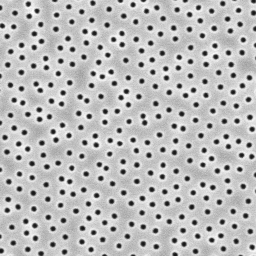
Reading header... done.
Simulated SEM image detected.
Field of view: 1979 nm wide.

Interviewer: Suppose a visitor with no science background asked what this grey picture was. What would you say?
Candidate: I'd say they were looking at a regular array of holes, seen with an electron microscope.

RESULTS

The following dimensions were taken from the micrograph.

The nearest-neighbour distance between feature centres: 92.5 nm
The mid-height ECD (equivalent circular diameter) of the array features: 44.5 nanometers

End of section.